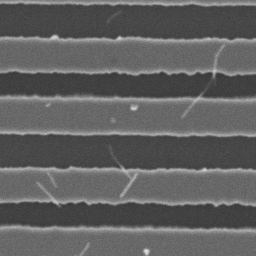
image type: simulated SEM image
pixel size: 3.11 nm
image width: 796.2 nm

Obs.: lines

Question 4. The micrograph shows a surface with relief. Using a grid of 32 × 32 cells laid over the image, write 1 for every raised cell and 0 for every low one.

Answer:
00000111011111111111111111111111
00000000000000000000000000000000
00000000000000000000000000000000
00000000000000000000000000000000
00000000000000000000000000000000
11111111111111111111111111111111
11111111111111111111111111111111
11111111111111111111111111111111
11111111111111111111111111111111
00000000000000000000000000000000
00000000000000000000000000000000
00000000000000000000000000000000
11111111111111111111111111111111
11111111111111111111111111111111
11111111111111111111111111111111
11111111111111111111111111111111
11111111111111111111111111111111
00000000000000000000000000000000
00000000000000000000000000000000
00000000000000000000000000000000
00000000000000000000000000000000
11111111111111111111111111111111
11111111111111111111111111111111
11111111111111111111111111111111
11111111111111111111111111111111
00000001000000100000011010011011
00000000000000000000000000000000
00000000000000000000000000000000
11110011000000000000000000000000
11111111111111111111111111111111
11111111111111111111111111111111
11111111111111111111111111111111